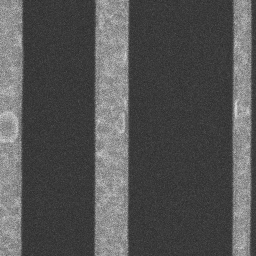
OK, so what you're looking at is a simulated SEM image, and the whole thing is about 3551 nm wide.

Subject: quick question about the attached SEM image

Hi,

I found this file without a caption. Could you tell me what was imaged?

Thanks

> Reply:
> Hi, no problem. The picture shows one or a few lines or trenches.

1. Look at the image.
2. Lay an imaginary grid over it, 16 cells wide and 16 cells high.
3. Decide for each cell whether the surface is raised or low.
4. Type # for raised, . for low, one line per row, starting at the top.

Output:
.#####..#######.
.#####..#######.
.#####..#######.
.#####..#######.
.#####..#######.
.#####..#######.
.#####..#######.
######..#######.
######..#######.
.#####..#######.
.#####..#######.
.#####..#######.
.#####..#######.
.#####..#######.
.#####..#######.
.#####..#######.